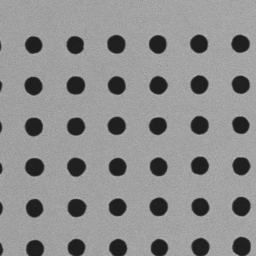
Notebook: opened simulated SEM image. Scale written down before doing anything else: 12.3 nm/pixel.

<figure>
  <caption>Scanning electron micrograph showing a regular array of holes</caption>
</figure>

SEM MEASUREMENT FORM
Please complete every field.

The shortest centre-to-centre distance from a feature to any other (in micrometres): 0.497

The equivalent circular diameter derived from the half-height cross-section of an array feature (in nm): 224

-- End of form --